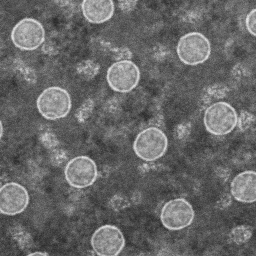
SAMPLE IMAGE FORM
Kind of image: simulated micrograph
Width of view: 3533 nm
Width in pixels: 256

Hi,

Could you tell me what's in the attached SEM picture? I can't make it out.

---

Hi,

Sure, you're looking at a regular array of raised bodies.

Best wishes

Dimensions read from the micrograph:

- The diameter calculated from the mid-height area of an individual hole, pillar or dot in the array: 424 nanometers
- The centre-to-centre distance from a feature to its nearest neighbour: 73.7 pixels